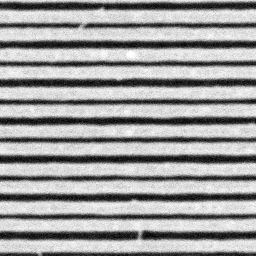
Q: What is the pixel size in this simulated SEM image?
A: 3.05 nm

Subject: parallel lines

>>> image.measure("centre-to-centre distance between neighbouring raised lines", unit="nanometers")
58.5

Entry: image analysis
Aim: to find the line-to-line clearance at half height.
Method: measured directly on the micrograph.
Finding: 23.3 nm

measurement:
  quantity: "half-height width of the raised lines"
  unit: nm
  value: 36.3